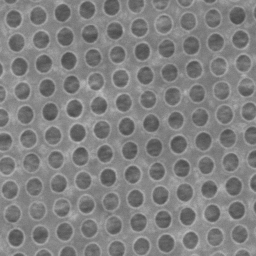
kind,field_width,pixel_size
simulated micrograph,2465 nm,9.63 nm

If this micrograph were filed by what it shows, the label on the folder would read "a regular array of holes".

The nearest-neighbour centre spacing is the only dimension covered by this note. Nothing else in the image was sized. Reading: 232 nanometres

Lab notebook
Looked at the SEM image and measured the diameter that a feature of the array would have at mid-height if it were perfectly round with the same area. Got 0.168 micrometres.